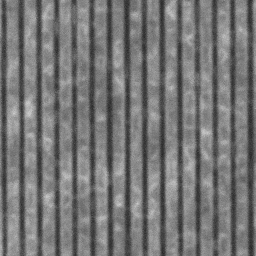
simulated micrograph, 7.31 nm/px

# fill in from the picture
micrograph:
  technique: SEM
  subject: parallel lines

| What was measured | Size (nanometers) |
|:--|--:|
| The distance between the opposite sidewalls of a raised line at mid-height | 79.5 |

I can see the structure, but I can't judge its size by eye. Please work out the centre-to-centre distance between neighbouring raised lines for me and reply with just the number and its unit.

0.129 um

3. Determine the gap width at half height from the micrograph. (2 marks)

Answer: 50.3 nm